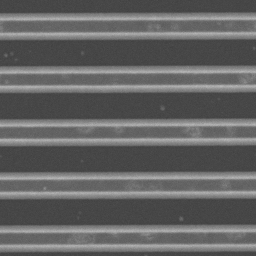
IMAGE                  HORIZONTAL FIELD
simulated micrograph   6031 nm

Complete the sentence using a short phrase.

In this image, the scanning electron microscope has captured parallel lines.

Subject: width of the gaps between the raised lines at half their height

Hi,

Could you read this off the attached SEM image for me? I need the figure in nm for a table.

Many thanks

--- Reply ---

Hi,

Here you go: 754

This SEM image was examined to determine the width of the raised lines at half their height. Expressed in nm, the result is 495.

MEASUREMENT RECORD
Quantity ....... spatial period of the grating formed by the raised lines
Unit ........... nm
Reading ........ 1250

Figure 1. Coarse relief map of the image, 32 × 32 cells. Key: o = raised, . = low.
................................
................................
oooooooooooooooooooooooooooooooo
oooooooooooooooooooooooooooooooo
ooooooooooooooo.o..oo.oo.ooo....
................................
................................
................................
................................
oooooooooooooooooooooooooooooooo
oooooooooooooooooooooooooooooooo
................................
................................
................................
................................
oooooooooooooooooooooooooooooooo
oooooooooooooooooooooooooooooooo
oooooooooooooooooooooooooooooooo
................................
................................
................................
................................
oooooooooooooooooooooooooooooooo
oooooooooooooooooooooooooooooooo
ooo..o.oooooooo.................
................................
................................
................................
.................o..ooooooooooo.
oooooooooooooooooooooooooooooooo
oooooooooooooooooooooooooooooooo
................................